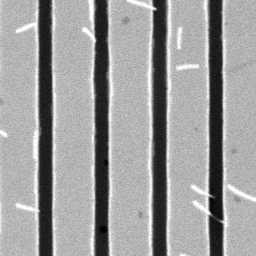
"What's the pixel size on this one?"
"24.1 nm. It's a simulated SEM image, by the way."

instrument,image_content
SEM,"lines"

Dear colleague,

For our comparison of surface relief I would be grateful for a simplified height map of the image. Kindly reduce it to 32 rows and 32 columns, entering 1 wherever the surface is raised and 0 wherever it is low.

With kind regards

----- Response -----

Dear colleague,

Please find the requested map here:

11111001111100111110011111001111
11111001111100111110011111001111
11111001111100111110011111001111
11111001111100111110011111001111
11111001111100111110011111001111
11111001111100111110011111001111
11111001111100111110011111001111
11111001111100111110011111001111
11111001111100111110011111001111
11111001111100111110011111001111
11111001111100111110011111001111
11111001111100111110011111001111
11111001111100111110011111001111
11111001111100111110011111001111
11111001111100111110011111001111
11111001111100111110011111001111
11111001111100111110011111001111
11111001111100111110011111001111
11111001111100111110011111001111
11111001111100111110011111001111
11111001111100111110011111001111
11111001111100111110011111001111
11111001111100111110011111001111
11111001111100111110011111001111
11111001111100111110011111001111
11111001111100111110011111001111
11111001111100111110011111001111
11111001111100111110011111001111
11111001111100111110011111001111
11111001111100111110011111001111
11111001111100111110011111001111
11111001111100111110011111001111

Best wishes